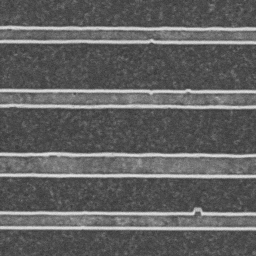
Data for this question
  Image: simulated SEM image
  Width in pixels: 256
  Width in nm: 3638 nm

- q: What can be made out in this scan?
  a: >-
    one or a few lines or trenches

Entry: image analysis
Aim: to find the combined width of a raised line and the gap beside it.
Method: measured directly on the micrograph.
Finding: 910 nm